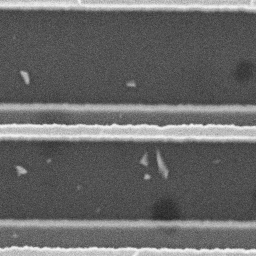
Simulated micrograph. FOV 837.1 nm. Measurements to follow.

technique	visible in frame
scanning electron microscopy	lines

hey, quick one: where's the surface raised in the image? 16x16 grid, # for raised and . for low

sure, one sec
.............#.#
................
................
................
................
................
................
################
################
................
................
................
................
................
################
################